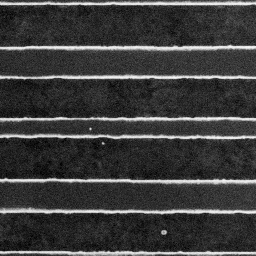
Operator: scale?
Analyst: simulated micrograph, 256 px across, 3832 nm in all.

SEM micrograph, lines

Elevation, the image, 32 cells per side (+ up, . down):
.++++++++.++++.+.+++.+..++.++.++
................................
................................
................................
................................
................................
++++++++++++++++++++++++++++++++
++++++++++++++++++++++++++++++++
++++++++++++++++++++++++++++++++
++++++++++++++++++++++++++++++++
................................
................................
................................
................................
................................
++++++++++++++++++++++++++++++++
++++++++++++++++++++++++++++++++
................................
................................
................................
................................
................................
++...+++........................
++++++++++++++++++++++++++++++++
++++++++++++++++++++++++++++++++
++++++++++++++++++++++++++++++++
...................++...........
................................
................................
................................
................................
+++++...........................